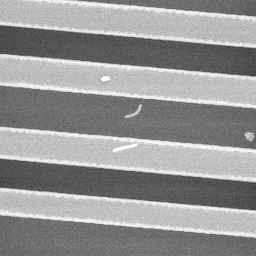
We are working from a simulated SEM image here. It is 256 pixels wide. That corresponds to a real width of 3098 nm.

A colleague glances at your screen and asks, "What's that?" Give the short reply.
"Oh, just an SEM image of lines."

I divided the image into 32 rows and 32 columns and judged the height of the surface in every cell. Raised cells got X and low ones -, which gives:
XXXXXXXXXXXXXX------------------
XXXXXXXXXXXXXXXXXXXXXXXXX-------
XXXXXXXXXXXXXXXXXXXXXXXXXXXXXXXX
----XXXXXXXXXXXXXXXXXXXXXXXXXXXX
---------------XXXXXXXXXXXXXXXXX
--------------------------XXXXXX
--------------------------------
XXXXXXXXX-----------------------
XXXXXXXXXXXXXXXXXXXX------------
XXXXXXXXXXXXXXXXXXXXXXXXXXXXXX--
XXXXXXXXXXXXXXXXXXXXXXXXXXXXXXXX
---------XXXXXXXXXXXXXXXXXXXXXXX
---------------------XXXXXXXXXXX
--------------------------------
--------------------------------
--------------------------------
XXXXXXX-------------------------
XXXXXXXXXXXXXXXXXXX-------------
XXXXXXXXXXXXXXXXXXXXXXXXXXXXXX--
XXXXXXXXXXXXXXXXXXXXXXXXXXXXXXXX
--------XXXXXXXXXXXXXXXXXXXXXXXX
------------------XXXXXXXXXXXXXX
-----------------------------XXX
--------------------------------
XXXXXXXXXXX---------------------
XXXXXXXXXXXXXXXXXXXXXX----------
XXXXXXXXXXXXXXXXXXXXXXXXXXXXXXXX
--------XXXXXXXXXXXXXXXXXXXXXXXX
-------------------XXXXXXXXXXXXX
-------------------------------X
--------------------------------
--------------------------------